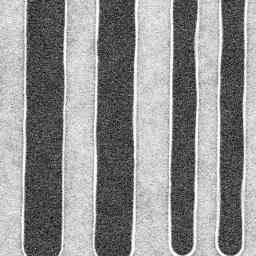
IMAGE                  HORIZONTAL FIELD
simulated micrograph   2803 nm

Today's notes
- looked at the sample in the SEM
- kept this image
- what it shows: groups of lines, slits or small figures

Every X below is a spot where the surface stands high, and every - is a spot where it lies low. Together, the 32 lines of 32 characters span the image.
---XXXXX----XXXXX----XXXX--XXXX-
---XXXXX----XXXXX----XXXX--XXXX-
---XXXXX----XXXXX----XXXX---XXX-
---XXXXX----XXXXX----XXXX---XXX-
---XXXXX----XXXXX----XXXX---XXX-
---XXXXX----XXXXX----XXXX---XXX-
---XXXXX----XXXXX----XXXX--XXXX-
---XXXXX----XXXXX----XXXX--XXXX-
---XXXXX----XXXXX----XXXX--XXXX-
---XXXXX----XXXXX----XXXX--XXXX-
---XXXXX----XXXXX----XXXX--XXXX-
---XXXXX----XXXXX----XXXX--XXXX-
---XXXXX----XXXXX----XXXX--XXXX-
---XXXXX----XXXXX----XXXX--XXXX-
---XXXXX----XXXXX----XXXX--XXXX-
---XXXXX----XXXXX----XXXX--XXXX-
---XXXXX----XXXXX----XXXX--XXXX-
---XXXXX----XXXXX----XXXX--XXXX-
---XXXXX----XXXXX----XXXX--XXXX-
---XXXXX----XXXXX----XXXX--XXXX-
---XXXXX----XXXXX----XXXX--XXXX-
---XXXXX----XXXXX----XXXX--XXXX-
---XXXXX----XXXXX----XXX---XXXX-
---XXXXX----XXXXX----XXX---XXX--
---XXXXX----XXXXX----XXXX--XXX--
---XXXXX----XXXXX----XXX---XXX--
---XXXXX----XXXXX----XXX---XXX--
---XXXXX----XXXXX----XXX---XXX--
---XXXXX----XXXXX----XXX---XXX--
---XXXXX----XXXXX----XXX---XXX--
---XXXXX----XXXXX----XXX---XXX--
---XXXXX----XXXXX-----XX---XXX--